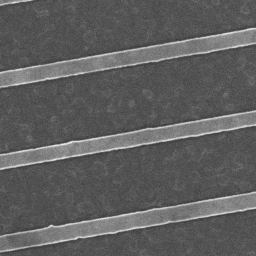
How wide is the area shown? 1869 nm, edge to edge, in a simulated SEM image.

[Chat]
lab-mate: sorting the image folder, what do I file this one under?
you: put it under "one or a few lines or trenches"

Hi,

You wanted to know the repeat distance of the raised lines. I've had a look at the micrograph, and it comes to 80.8 pixels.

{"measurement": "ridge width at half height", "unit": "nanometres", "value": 105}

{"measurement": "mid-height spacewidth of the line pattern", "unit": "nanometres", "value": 485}